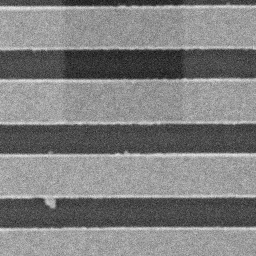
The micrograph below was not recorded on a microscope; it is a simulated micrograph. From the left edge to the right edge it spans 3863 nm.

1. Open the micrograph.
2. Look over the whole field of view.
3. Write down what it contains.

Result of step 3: lines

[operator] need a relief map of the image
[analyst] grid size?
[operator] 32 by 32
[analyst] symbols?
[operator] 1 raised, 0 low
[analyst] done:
00000000000000000000000000000000
11111111111111111111111111111111
11111111111111111111111111111111
11111111111111111111111111111111
11111111111111111111111111111111
11111111111111111111111111111111
00000000000000000000000000000000
00000000000000000000000000000000
00000000000000000000000000000000
00000000000000000000000000000000
11111111111111111111111111111111
11111111111111111111111111111111
11111111111111111111111111111111
11111111111111111111111111111111
11111111111111111111111111111111
00000000000000000000000000000000
00000000000000000000000000000000
00000000000000000000000000000000
00000000000000000000000000000000
11111111111111111111111111111111
11111111111111111111111111111111
11111111111111111111111111111111
11111111111111111111111111111111
11111111111111111111111111111111
11111111111111111111111111111111
00000000000000000000000000000000
00000000000000000000000000000000
00000000000000000000000000000000
00000000000000000000000000000000
11111111111111111111111111111111
11111111111111111111111111111111
11111111111111111111111111111111